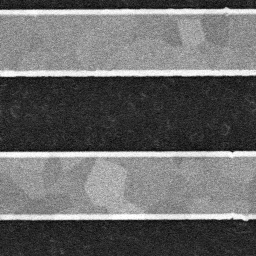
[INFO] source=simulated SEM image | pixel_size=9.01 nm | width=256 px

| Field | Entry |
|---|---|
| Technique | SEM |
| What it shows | one or a few lines or trenches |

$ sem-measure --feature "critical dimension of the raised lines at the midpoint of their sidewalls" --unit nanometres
562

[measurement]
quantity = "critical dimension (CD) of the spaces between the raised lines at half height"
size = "730 nanometers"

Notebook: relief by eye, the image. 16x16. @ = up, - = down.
----------------
@@@@@@@@@@@@@@@@
@@@@@@@@@@@@@@@@
@@@@@@@@@@@@@@@@
@@@@@@@@@@@@@@@@
----------------
----------------
----------------
----------------
----------------
@@@@@@@@@@@@@@@@
@@@@@@@@@@@@@@@@
@@@@@@@@@@@@@@@@
@@@@@@@@@@@@@@@@
----------------
----------------